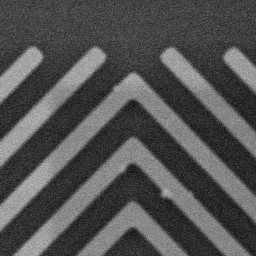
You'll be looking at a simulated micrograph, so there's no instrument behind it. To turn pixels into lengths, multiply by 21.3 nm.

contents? groups of lines, slits or small figures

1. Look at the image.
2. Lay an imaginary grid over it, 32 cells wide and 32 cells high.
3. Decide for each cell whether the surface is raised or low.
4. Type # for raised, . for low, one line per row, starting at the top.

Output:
................................
................................
................................
................................
................................
................................
...##......##........#......##..
..###.....###.......###.....###.
.###.....###.........###.....###
###.....###.....#.....###.....##
##.....###.....###.....###.....#
#.....###.....#####.....###.....
.....###.....###.###.....###....
....###.....###...###.....###...
...###.....###.....###.....###..
..###.....###.......###.....###.
.###.....###.........###.....###
###.....###.....#.....###.....##
##.....###.....###.....###.....#
#.....###.....#####.....###.....
.....###.....###.###.....###....
....###.....###...###.....###...
...###.....###.....###.....###..
..###.....###.......###.....###.
.###.....###........####.....###
###.....###.....#.....###.....##
##.....###.....###.....###.....#
#.....###.....#####.....###.....
.....###.....###.###.....###....
....###.....###...###.....###...
...###.....###.....###.....###..
..###.....###.......###.....###.